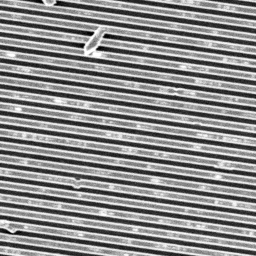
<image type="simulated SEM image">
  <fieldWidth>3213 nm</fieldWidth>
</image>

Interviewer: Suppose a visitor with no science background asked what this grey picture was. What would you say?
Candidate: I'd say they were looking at parallel lines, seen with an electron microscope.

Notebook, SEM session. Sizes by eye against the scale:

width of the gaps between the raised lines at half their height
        68.4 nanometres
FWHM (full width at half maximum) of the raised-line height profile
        0.0901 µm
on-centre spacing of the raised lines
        162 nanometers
